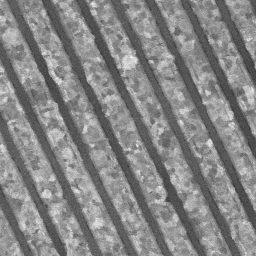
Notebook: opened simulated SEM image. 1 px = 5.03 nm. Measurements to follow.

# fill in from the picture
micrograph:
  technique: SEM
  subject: parallel lines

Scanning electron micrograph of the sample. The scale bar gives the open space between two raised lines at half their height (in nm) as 55.6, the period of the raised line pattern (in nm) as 157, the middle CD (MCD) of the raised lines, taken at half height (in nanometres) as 102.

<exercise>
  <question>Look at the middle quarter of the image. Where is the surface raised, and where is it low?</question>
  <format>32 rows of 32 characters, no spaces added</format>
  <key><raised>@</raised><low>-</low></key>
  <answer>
@@---@@@@@---@@@@@@---@@@@@@---@
@@---@@@@@@---@@@@@----@@@@@---@
@@---@@@@@@---@@@@@@---@@@@@@---
@@@---@@@@@@---@@@@@----@@@@@---
@@@@--@@@@@@---@@@@@@---@@@@@---
@@@@---@@@@@@---@@@@@----@@@@@--
@@@@----@@@@@---@@@@@@---@@@@@--
@@@@@---@@@@@----@@@@@---@@@@@@-
@@@@@----@@@@@---@@@@@@---@@@@@-
-@@@@@---@@@@@----@@@@@----@@@@@
-@@@@@@--@@@@@@---@@@@@@---@@@@@
--@@@@@---@@@@@@---@@@@@----@@@@
--@@@@@@--@@@@@@---@@@@@@---@@@@
--@@@@@@---@@@@@----@@@@@----@@@
---@@@@@----@@@@@---@@@@@----@@@
---@@@@@@---@@@@@----@@@@@---@@@
@---@@@@@---@@@@@@---@@@@@@---@@
@----@@@@@---@@@@@----@@@@@---@@
@@---@@@@@---@@@@@@---@@@@@@---@
@@---@@@@@@---@@@@@----@@@@@---@
@@@---@@@@@---@@@@@@---@@@@@@---
@@@---@@@@@@---@@@@@----@@@@@---
@@@@---@@@@@---@@@@@@---@@@@@---
@@@@---@@@@@@---@@@@@----@@@@@--
@@@@----@@@@@---@@@@@@---@@@@@--
@@@@@---@@@@@@---@@@@@@--@@@@@@-
@@@@@----@@@@@---@@@@@@---@@@@@-
@@@@@@---@@@@@@---@@@@@---@@@@@@
-@@@@@----@@@@@---@@@@@@---@@@@@
-@@@@@@---@@@@@@---@@@@@---@@@@@
--@@@@@---@@@@@@---@@@@@@---@@@@
--@@@@@@---@@@@@@---@@@@@---@@@@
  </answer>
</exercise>